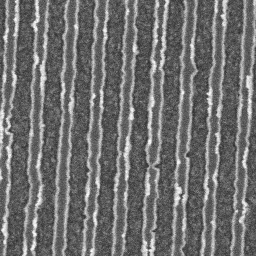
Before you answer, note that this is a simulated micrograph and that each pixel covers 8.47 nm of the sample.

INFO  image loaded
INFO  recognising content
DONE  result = parallel lines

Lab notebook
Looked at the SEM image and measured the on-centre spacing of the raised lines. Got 251 nanometers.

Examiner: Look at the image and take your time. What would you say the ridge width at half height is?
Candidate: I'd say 97.3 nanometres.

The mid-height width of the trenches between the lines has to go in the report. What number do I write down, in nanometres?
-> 157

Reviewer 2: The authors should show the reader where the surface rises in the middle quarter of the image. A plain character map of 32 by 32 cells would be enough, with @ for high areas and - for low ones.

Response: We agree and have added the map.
@@@----@@@-----@@@----@@@-----@@
@@@----@@@-----@@-----@@@----@@@
@@@----@@@-----@@-----@@@----@@@
@@@----@@@-----@@-----@@@----@@@
@@-----@@@-----@@-----@@@----@@@
@@-----@@@----@@@-----@@-----@@@
@@-----@@@----@@@-----@@-----@@@
@@-----@@@----@@@-----@@@----@@@
@@-----@@@----@@@-----@@@----@@@
@@-----@@@----@@@-----@@@----@@@
@@-----@@@----@@@----@@@-----@@@
@@-----@@@----@@@@---@@@-----@@@
@@-----@@-----@@@----@@@-----@@@
@@-----@@-----@@@----@@@-----@@@
@@-----@@-----@@@----@@@-----@@@
@@-----@@-----@@@----@@@-----@@-
@------@@-----@@@----@@@-----@@-
@@----@@@@----@@@----@@@-----@@-
@@----@@@@----@@-----@@@----@@@@
@@----@@@-----@@-----@@@----@@@-
@@----@@@-----@@@----@@@----@@@-
@@----@@@-----@@-----@@@----@@@-
@@----@@@-----@@-----@@@----@@--
@-----@@@----@@@-----@@@----@@@-
@-----@@@----@@@-----@@-----@@@-
@-----@@@----@@@-----@@-----@@@-
@------@@-----@@-----@@@----@@@-
@-----@@@----@@@-----@@@----@@@-
@-----@@@----@@@-----@@@----@@@-
@-----@@@----@@@-----@@-----@@@-
@-----@@@----@@@-----@@-----@@@-
@-----@@@----@@@----@@@-----@@@-